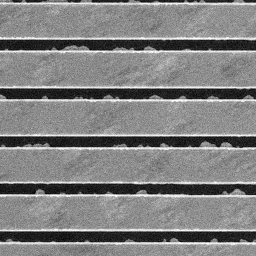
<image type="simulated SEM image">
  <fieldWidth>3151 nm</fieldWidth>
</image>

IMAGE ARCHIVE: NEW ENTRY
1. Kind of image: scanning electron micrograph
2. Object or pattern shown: lines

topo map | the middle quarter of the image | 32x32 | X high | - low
XXXXXXXXXXXXXXXXXXXXXXXXXXXXXXXX
XXXXXXXXXXXXXXXXXXXXXXXXXXXXXXXX
XXXXXXXXXXXXXXXXXXXXXXXXXXXXXXXX
XXXXXXXXXXXXXXXXXXXXXXXXXXXXXXXX
XXXXXXXXXXXXXXXXXXXXXXXXXXXXXXXX
XXXXXXXXXXXXXXXXXXXXXXXXXXXXXXXX
--------------------------------
--------------------------------
--------------------------------
XXXXXXXXXXXXXXXXXXXXXXXXXXXXXXXX
XXXXXXXXXXXXXXXXXXXXXXXXXXXXXXXX
XXXXXXXXXXXXXXXXXXXXXXXXXXXXXXXX
XXXXXXXXXXXXXXXXXXXXXXXXXXXXXXXX
XXXXXXXXXXXXXXXXXXXXXXXXXXXXXXXX
XXXXXXXXXXXXXXXXXXXXXXXXXXXXXXXX
XXXXXXXXXXXXXXXXXXXXXXXXXXXXXXXX
XXXXXXXXXXXXXXXXXXXXXXXXXXXXXXXX
XXXXXXXXXXXXXXXXXXXXXXXXXXXXXXXX
--------------------------------
--------------------------------
--------------------------------
XXXXXXXXXXXXXXXXXXXXXXXXXXXXXXXX
XXXXXXXXXXXXXXXXXXXXXXXXXXXXXXXX
XXXXXXXXXXXXXXXXXXXXXXXXXXXXXXXX
XXXXXXXXXXXXXXXXXXXXXXXXXXXXXXXX
XXXXXXXXXXXXXXXXXXXXXXXXXXXXXXXX
XXXXXXXXXXXXXXXXXXXXXXXXXXXXXXXX
XXXXXXXXXXXXXXXXXXXXXXXXXXXXXXXX
XXXXXXXXXXXXXXXXXXXXXXXXXXXXXXXX
XXXXXXXXXXXXXXXXXXXXXXXXXXXXXXXX
--------------------------------
--------------------------------